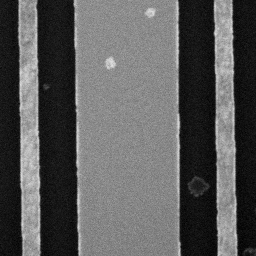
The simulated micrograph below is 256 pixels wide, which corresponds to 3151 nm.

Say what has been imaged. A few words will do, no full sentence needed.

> lines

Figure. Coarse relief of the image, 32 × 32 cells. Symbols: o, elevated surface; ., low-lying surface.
..ooo....ooooooooooooo.....oo...
..ooo....ooooooooooooo.....oo...
..ooo....ooooooooooooo.....oo...
..ooo....ooooooooooooo.....oo...
..ooo....ooooooooooooo.....oo...
..ooo....ooooooooooooo.....oo...
...oo.....oooooooooooo.....oo...
...oo.....oooooooooooo.....oo...
...oo.....oooooooooooo.....oo...
...oo.....oooooooooooo.....oo...
...oo.....oooooooooooo.....oo...
...oo.....oooooooooooo.....oo...
...oo.....oooooooooooo.....oo...
...oo.....oooooooooooo.....oo...
...oo.....oooooooooooo.....oo...
...oo.....oooooooooooo.....oo...
...oo.....oooooooooooo.....oo...
...oo.....oooooooooooo.....oo...
...oo.....oooooooooooo.....oo...
...oo.....oooooooooooo.....oo...
...oo.....oooooooooooo.....oo...
...oo.....oooooooooooo.....oo...
...oo.....oooooooooooo.....oo...
...oo.....oooooooooooo.....oo...
...oo.....oooooooooooo.....oo...
...oo.....oooooooooooo.....oo...
...oo.....oooooooooooo.....oo...
...oo.....oooooooooooo.....oo...
...oo.....oooooooooooo.....oo...
...oo.....oooooooooooo.....oo...
...oo.....oooooooooooo.....ooo..
...oo.....oooooooooooo.....ooo..